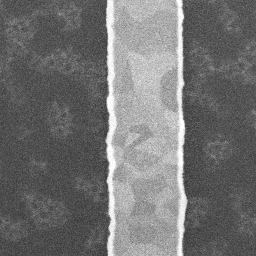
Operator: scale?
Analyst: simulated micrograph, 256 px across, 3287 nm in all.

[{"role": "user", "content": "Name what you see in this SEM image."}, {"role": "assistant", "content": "one or a few lines or trenches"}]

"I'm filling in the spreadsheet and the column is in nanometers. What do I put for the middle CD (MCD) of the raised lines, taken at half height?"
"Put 900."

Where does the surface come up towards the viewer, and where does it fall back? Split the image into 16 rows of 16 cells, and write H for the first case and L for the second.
LLLLLLLHHHHLLLLL
LLLLLLLHHHHLLLLL
LLLLLLLHHHHLLLLL
LLLLLLLHHHHLLLLL
LLLLLLLHHHHLLLLL
LLLLLLLHHHHLLLLL
LLLLLLLHHHHLLLLL
LLLLLLLHHHHLLLLL
LLLLLLLHHHHLLLLL
LLLLLLLHHHHLLLLL
LLLLLLLHHHHLLLLL
LLLLLLLHHHHLLLLL
LLLLLLLHHHHLLLLL
LLLLLLLHHHHLLLLL
LLLLLLLHHHHLLLLL
LLLLLLLHHHHLLLLL